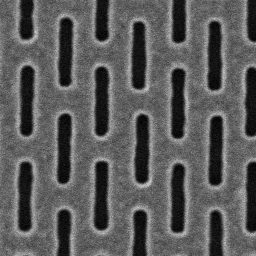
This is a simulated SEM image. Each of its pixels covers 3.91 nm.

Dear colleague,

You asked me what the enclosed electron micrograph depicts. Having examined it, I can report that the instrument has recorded a regular array of holes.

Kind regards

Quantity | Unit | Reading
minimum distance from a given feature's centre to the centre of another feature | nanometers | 235